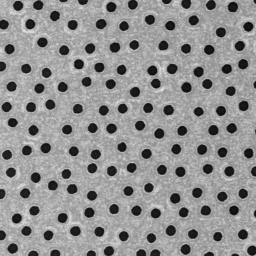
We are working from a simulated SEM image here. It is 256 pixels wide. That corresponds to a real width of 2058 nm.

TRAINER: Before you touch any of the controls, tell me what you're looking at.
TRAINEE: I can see a regular array of holes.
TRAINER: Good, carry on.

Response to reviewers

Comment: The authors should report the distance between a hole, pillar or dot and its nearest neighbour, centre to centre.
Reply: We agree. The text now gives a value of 158 nanometres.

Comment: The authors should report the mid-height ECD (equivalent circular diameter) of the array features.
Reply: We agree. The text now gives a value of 0.0847 micrometres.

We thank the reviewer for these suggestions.